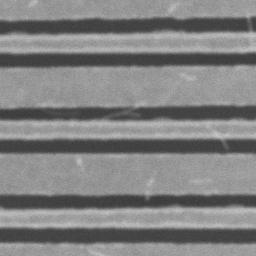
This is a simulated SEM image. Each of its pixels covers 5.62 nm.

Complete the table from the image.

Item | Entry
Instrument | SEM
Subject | lines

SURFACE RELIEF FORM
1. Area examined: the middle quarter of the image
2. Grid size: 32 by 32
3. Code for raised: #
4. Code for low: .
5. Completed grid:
................................
################################
################################
################################
################################
################################
################################
################################
################################
################################
########################.#......
................................
................................
................................
##.#########....##......#.######
################################
################################
################################
.#...#######...##...###.####...#
................................
................................
................................
................................
################################
################################
################################
################################
################################
################################
################################
################################
################################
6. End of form